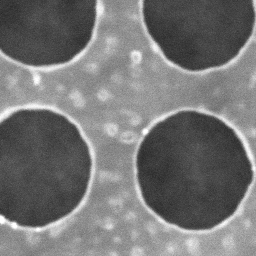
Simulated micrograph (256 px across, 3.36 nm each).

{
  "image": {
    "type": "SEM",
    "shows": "holes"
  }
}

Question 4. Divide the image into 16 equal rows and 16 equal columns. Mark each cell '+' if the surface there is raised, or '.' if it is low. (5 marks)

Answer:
......+++.......
......+++.......
......++++......
.....+++++.....+
++++++++++++++++
++++++++++++++++
++++++++++++++++
....++++++....++
.....++++......+
......+++......+
......+++.......
......+++.......
.....++++......+
....++++++....++
++++++++++++++++
++++++++++++++++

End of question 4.